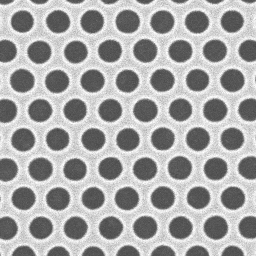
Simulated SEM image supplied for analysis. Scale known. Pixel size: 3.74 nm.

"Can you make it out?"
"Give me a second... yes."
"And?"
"a regular array of holes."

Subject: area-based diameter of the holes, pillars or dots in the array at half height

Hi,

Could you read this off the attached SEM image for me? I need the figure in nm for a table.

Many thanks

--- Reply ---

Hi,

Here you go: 89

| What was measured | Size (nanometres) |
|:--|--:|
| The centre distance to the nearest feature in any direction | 126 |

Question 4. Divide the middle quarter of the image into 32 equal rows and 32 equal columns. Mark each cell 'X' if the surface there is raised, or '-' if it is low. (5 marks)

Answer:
XXXXXXXXXXXXXXXXXXXXXXXXXXXXXXXX
XXXXXX--XXXXXXX--XXXXXX---XXXXXX
-XXXX-----XXXX----XXXX-----XXXX-
-XXX------XXX------XXX------XX--
-XXX------XXX------XXX------XX--
-XXX------XXX------XXX-----XXXX-
XXXXX----XXXXX----XXXXX---XXXXXX
XXXXXXXXXXXXXXXXXXXXXXXXXXXXXXXX
XXXXXXXXXXXXXXXXXXXXXXXXXXXXXXXX
X----XXXXX----XXXX----XXXXX----X
-----XXXX-----XXX------XXX------
------XXX------XX-------XX------
------XXX------XX------XXX------
X----XXXX-----XXXX-----XXXX----X
XX-XXXXXXXX-XXXXXXX--XXXXXXXX-XX
XXXXXXXXXXXXXXXXXXXXXXXXXXXXXXXX
XXXXXX---XXXXX----XXXXX----XXXX-
-XXXX-----XXX------XXX-----XXXX-
-XXX------XXX------XXX------XXX-
-XXX------XXX------XXX------XXX-
-XXXX-----XXX------XXX-----XXXX-
XXXXXX---XXXXXX--XXXXXXX-XXXXXXX
XXXXXXXXXXXXXXXXXXXXXXXXXXXXXXXX
XX-XXXXXXX---XXXXXX--XXXXXX----X
-----XXXX-----XXXX-----XXX------
-----XXXX------XX------XXX------
------XX-------XX------XXX------
-----XXXX-----XXX------XXX------
X----XXXXX---XXXXX----XXXXX----X
XXXXXXXXXXXXXXXXXXXXXXXXXXXXXXXX
XXXXXXXXXXXXXXXXXXXXXXXXXXXXXXXX
XXXXXX---XXXXX----XXXX-----XXXX-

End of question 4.